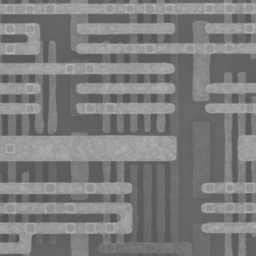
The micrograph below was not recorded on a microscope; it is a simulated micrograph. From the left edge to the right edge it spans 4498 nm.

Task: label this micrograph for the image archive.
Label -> wiring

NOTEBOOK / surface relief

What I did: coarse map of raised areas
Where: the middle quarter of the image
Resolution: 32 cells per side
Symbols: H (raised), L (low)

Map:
HHHHHHHHHHHHHHHHHHHHHHHHHHHLLLLL
HHHHHHHHHHHHHHHHHHHHHHHHHHHHLLLL
LLLLLLLLLLLLLLLLLLLLLLLLLLLLLLLL
LLLLLLLLLLLLLLLLLLLLLLLLLLLLLLLL
LLLLLLLLLLLLLLLLLLLLLLLLLLLLLLLL
LLLHHHHHHHHHHHHHHHHHHHHHHHHHLLLL
LLLHHHHHHHHHHHHHHHHHHHHHHHHHLLLL
LLLLLLLLLLLLLLLLLLLLLLLLLLLLLLLL
LLLLLLLLLLLLLLLLLLLLLLLLLLLLLLLL
LLLLLLLLLLLLLLLLLLLLLLLLLLLLLLLL
LLLHHHHHHHHHHHHHHHHHHHHHHHHHLLLL
LLLHHHHHHHHHHHHHHHHHHHHHHHHHLLLL
LLLLLLLLLLLLLLLLLLLLLLLLLLLLLLLL
LLLLLLLLLLLLLLLLLLLLLLLLLLLLLLLL
LLLLLLLLLLLLLLLLLLLLLLLLLLLLLLLL
LLLLLLLLLLLLLLLLLLLLLLLLLLLLLLLL
LLLLLLLLLLLLLLLLLLLLLLLLLLLLLLLL
LLLLLLLLLLLLLLLLLLLLLLLLLLLLLLLL
HHHHHHHHHHHHHHHHHHHHHHHHHHHHLLLL
HHHHHHHHHHHHHHHHHHHHHHHHHHHHLLLL
HHHHHHHHHHHHHHHHHHHHHHHHHHHHLLLL
HHHHHHHHHHHHHHHHHHHHHHHHHHHHLLLL
HHHHHHHHHHHHHHHHHHHHHHHHHHHHLLLL
HHHHHHHHHHHHHHHHHHHHHHHHHHHHLLLL
LLLLLLLLLLLLLLLLLLLLLLLLLLLLLLLL
LLLLLLLLLLLLLLLLLLLLLLLLLLLLLLLL
LLLLLLLLLLLLLLLLLLLLLLLLLLLLLLLL
LLLLLLLLLLLLLLLLLLLLLLLLLLLLLLLL
LLLLLLLLLLLLLLLLLLLLLLLLLLLLLLLL
LLLLLLLLLLLLLLLLLLLLLLLLLLLLLLLL
HHHHHHHHHHHHHHHHHLLLLLLLLLLLLLLL
HHHHHHHHHHHHHHHHHLLLLLLLLLLLLLLL